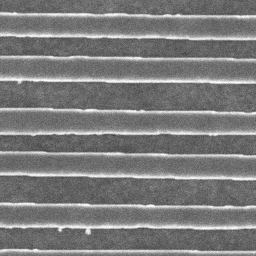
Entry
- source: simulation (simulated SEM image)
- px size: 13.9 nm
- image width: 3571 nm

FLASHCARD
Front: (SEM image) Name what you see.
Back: lines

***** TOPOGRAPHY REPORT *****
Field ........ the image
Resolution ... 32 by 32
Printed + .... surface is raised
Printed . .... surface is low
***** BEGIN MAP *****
................................
................................
++++++++++++++++++++++++++++++++
++++++++++++++++++++++++++++++++
....+.++++++++++++++++++++++++++
................................
................................
++++++++++++++++++++++++++++++++
++++++++++++++++++++++++++++++++
++++++++++++++++++++++++++++++++
................................
................................
................................
................................
++++++++++++++++++++++++++++++++
++++++++++++++++++++++++++++++++
++++++++++++++++++++++++++++++++
................................
................................
+++++++++++++++++++++++++++++++.
++++++++++++++++++++++++++++++++
++++++++++++++++++++++++++++++++
................................
................................
................................
+++++...........................
++++++++++++++++++++++++++++++++
++++++++++++++++++++++++++++++++
................................
................................
................................
++++++++++++++++++++++++++++++++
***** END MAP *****